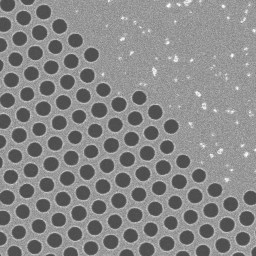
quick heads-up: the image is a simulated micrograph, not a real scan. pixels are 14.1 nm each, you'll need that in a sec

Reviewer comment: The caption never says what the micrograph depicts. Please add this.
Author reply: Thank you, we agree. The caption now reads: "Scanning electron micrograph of a regular array of holes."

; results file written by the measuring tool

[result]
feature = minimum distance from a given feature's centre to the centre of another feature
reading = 20.8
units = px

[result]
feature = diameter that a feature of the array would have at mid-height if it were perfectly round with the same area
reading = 14.4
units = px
